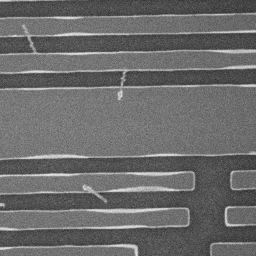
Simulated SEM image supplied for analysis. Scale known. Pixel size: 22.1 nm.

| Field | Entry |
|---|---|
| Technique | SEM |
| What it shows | groups of lines, slits or small figures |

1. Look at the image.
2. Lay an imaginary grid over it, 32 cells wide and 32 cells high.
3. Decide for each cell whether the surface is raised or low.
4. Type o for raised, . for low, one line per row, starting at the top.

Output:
................................
................................
oooooooooooooooooooooooooooooooo
oooooooooooooooooooooooooooooooo
...o............................
................................
...................ooooooooooooo
oooooooooooooooooooooooooooooooo
oooooooooooooooooooooooooooo....
................................
................................
oooooooooooooooooooooooooooooooo
oooooooooooooooooooooooooooooooo
oooooooooooooooooooooooooooooooo
oooooooooooooooooooooooooooooooo
oooooooooooooooooooooooooooooooo
oooooooooooooooooooooooooooooooo
oooooooooooooooooooooooooooooooo
oooooooooooooooooooooooooooooooo
ooooooooooooooooooo.............
................................
.......................o.....ooo
oooooooooooooooooooooooo.....ooo
oooooooooooooooooooooooo.....ooo
................................
................................
oooooooooooooooooooooooo....oooo
oooooooooooooooooooooooo....oooo
oooooo..........................
................................
...........................ooooo
ooooooooooooooooo.........oooooo